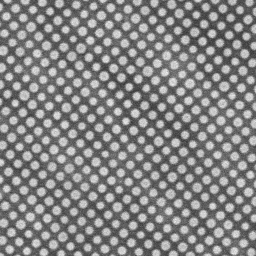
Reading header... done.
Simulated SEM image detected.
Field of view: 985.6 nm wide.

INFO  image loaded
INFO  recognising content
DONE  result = a regular array of raised bodies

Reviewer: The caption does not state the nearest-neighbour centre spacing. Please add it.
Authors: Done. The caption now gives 46 nanometres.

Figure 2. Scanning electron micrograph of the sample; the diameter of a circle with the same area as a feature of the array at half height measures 29.8 nm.